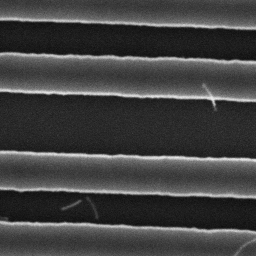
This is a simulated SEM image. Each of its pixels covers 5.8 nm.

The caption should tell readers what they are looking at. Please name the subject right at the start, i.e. lines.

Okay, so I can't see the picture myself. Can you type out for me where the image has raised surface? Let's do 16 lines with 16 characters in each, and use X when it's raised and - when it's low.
XXXXXXXXXXXXXXXX
-------XXXXXXXXX
----------------
XXXXXXX---------
XXXXXXXXXXXXXXXX
XXXXXXXXXXXXXXXX
----------------
----------------
----------------
X---------------
XXXXXXXXXXXXXXXX
XXXXXXXXXXXXXXXX
----------------
----------------
XXXXXXXXXXXXXXXX
XXXXXXXXXXXXXXXX